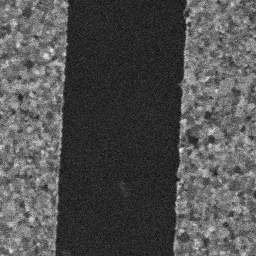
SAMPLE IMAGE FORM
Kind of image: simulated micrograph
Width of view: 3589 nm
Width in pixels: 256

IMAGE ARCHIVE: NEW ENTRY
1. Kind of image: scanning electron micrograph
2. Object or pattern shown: one or a few lines or trenches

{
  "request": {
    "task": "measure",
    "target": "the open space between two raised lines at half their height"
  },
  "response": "1680 nm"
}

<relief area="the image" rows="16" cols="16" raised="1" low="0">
1111000000001111
1111000000001111
1111000000001111
1111000000001111
1111000000001111
1111000000011111
1111000000011111
1111000000011111
1111000000011111
1111000000011111
1111000000011111
1111000000011111
1111000000011111
1111000000011111
1110000000011111
1110000000011111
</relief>